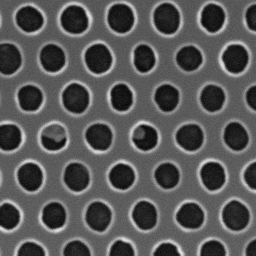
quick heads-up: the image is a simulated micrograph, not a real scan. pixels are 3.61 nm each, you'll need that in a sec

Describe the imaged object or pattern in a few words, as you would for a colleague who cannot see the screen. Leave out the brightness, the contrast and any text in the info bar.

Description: a regular array of holes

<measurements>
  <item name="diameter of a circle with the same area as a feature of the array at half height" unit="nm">97.4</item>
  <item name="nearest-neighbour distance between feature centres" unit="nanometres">162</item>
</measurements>